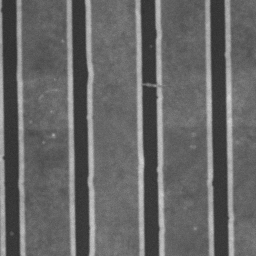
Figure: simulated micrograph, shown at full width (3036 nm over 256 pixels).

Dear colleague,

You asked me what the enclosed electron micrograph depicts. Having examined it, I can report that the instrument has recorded one or a few lines or trenches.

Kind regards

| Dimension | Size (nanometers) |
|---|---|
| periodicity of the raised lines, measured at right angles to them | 823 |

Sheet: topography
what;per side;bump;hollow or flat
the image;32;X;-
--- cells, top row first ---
--XXXXXXX--XXXXXX---XXXXXX--XXXX
--XXXXXXX--XXXXXX---XXXXXX--XXXX
--XXXXXXX--XXXXXX---XXXXXX---XXX
--XXXXXXX--XXXXXX---XXXXXX---XXX
--XXXXXXX--XXXXXX---XXXXXX---XXX
--XXXXXXX--XXXXXX---XXXXXX---XXX
--XXXXXXX--XXXXXX---XXXXXX--XXXX
--XXXXXXX--XXXXXX---XXXXXX--XXXX
--XXXXXXX--XXXXXX---XXXXXX--XXXX
--XXXXXXX--XXXXXX---XXXXXX---XXX
--XXXXXXX--XXXXXX---XXXXXX---XXX
---XXXXXX--XXXXXX---XXXXXX---XXX
---XXXXXX--XXXXXXX--XXXXXX---XXX
---XXXXXX--XXXXXXX--XXXXXX---XXX
---XXXXXX--XXXXXXX--XXXXXX---XXX
---XXXXXX--XXXXXXX--XXXXXX---XXX
---XXXXXX--XXXXXXX--XXXXXX---XXX
---XXXXXX--XXXXXXX--XXXXXX---XXX
---XXXXXX--XXXXXXX--XXXXXX---XXX
---XXXXXX--XXXXXXX--XXXXXX---XXX
---XXXXXX--XXXXXXX--XXXXXX---XXX
---XXXXXX--XXXXXXX--XXXXXX---XXX
---XXXXXX--XXXXXXX--XXXXXX---XXX
---XXXXXX--XXXXXXX--XXXXXX---XXX
---XXXXXX--XXXXXXX--XXXXXX---XXX
---XXXXXX---XXXXXX--XXXXXX---XXX
---XXXXXX--XXXXXXX--XXXXXX---XXX
---XXXXXX--XXXXXXX--XXXXXX---XXX
---XXXXXX--XXXXXXX--XXXXXX---XXX
---XXXXXX--XXXXXXX--XXXXXX---XXX
---XXXXXX--XXXXXXX--XXXXXX---XXX
---XXXXXX--XXXXXXX--XXXXXX---XXX